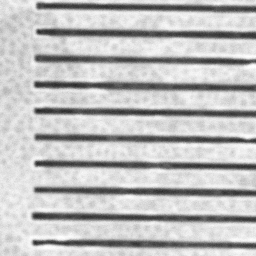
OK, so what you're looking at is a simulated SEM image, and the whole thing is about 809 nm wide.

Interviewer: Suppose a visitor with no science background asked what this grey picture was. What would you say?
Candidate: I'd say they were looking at parallel lines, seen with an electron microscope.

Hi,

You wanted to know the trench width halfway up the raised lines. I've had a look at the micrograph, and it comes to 24.5 nm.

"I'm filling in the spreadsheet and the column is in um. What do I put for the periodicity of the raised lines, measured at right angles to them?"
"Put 0.0834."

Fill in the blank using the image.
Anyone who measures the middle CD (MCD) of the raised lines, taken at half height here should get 57.2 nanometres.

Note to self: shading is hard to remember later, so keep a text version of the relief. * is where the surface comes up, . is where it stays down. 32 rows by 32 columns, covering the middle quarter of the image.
********************************
********************************
********************************
********************************
........*.............******..**
................................
**********......................
********************************
********************************
********************************
********************************
................................
................................
********************************
********************************
********************************
********************************
............******...***********
................................
................................
********************************
********************************
********************************
********************************
................................
................................
*************************......*
********************************
********************************
********************************
...*****************************
................................